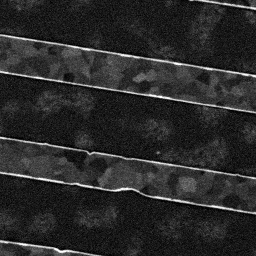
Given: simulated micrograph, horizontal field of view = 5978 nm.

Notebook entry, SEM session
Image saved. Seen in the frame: one or a few lines or trenches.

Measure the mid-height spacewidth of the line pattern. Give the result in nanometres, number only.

1510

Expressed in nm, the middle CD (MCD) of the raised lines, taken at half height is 849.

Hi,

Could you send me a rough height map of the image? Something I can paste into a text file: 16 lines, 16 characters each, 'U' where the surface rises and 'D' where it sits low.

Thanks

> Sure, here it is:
DDDDDDDDDDDDDDDU
DDDDDDDDDDDDDDDD
UUDDDDDDDDDDDDDD
UUUUUUUUDDDDDDDD
UUUUUUUUUUUUUUUD
DDDDDDUUUUUUUUUU
DDDDDDDDDDDDDUUU
DDDDDDDDDDDDDDDD
DDDDDDDDDDDDDDDD
UUUUUUDDDDDDDDDD
UUUUUUUUUUUUDDDD
DDDDUUUUUUUUUUUU
DDDDDDDDDDDUUUUU
DDDDDDDDDDDDDDDD
DDDDDDDDDDDDDDDD
UUUDDDDDDDDDDDDD